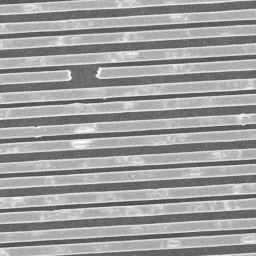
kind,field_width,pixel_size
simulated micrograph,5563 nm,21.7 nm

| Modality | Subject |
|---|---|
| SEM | parallel lines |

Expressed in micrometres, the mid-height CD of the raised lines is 0.236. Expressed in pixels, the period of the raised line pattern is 17.3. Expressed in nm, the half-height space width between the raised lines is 176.